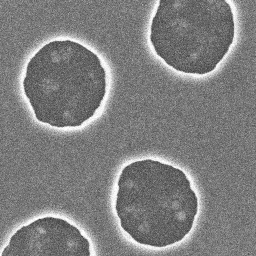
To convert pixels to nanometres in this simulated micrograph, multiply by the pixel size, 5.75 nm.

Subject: holes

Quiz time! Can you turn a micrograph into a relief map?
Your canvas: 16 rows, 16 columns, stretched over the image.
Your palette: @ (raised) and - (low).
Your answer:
@@@@@@@@@@----@@
@@@@@@@@@------@
@@@@@@@@@------@
@@----@@@@----@@
@@-----@@@@--@@@
@------@@@@@@@@@
@@----@@@@@@@@@@
@@@--@@@@@@@@@@@
@@@@@@@@@@@@@@@@
@@@@@@@@@@@@@@@@
@@@@@@@@---@@@@@
@@@@@@@-----@@@@
@@@@@@@-----@@@@
@@@@@@@-----@@@@
@----@@@----@@@@
------@@@@@@@@@@